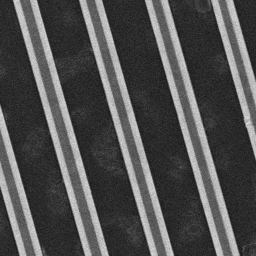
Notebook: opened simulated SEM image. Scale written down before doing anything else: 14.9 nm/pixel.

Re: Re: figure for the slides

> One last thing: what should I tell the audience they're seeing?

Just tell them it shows one or a few lines or trenches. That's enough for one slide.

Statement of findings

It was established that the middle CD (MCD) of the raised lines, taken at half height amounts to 237 nm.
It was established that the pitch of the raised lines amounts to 0.943 um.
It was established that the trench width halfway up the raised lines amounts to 700 nm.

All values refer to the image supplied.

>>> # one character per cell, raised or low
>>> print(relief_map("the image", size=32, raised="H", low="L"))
LLHHLLLLLLHHLLLLLLLHHLLLLLLHHLLL
LLHHHLLLLLLHHLLLLLLHHLLLLLLHHLLL
LLLHHLLLLLLHHLLLLLLHHLLLLLLHHLLL
LLLHHLLLLLLHHLLLLLLLHHLLLLLLHHLL
LLLHHLLLLLLLHHLLLLLLHHLLLLLLHHLL
LLLLHHLLLLLLHHLLLLLLHHLLLLLLHHLL
LLLLHHLLLLLLHHLLLLLLHHLLLLLLLHHL
LLLLHHLLLLLLHHLLLLLLLHHLLLLLLHHL
LLLLHHHLLLLLLHHLLLLLLHHLLLLLLHHL
LLLLLHHLLLLLLHHLLLLLLHHLLLLLLHHL
LLLLLHHLLLLLLHHLLLLLLHHHLLLLLLHH
LLLLLHHLLLLLLLHHLLLLLLHHLLLLLLHH
LLLLLLHHLLLLLLHHLLLLLLHHLLLLLLHH
LLLLLLHHLLLLLLHHLLLLLLHHLLLLLLLH
LLLLLLHHLLLLLLHHLLLLLLLHHLLLLLLH
LLLLLLHHHLLLLLLHHLLLLLLHHLLLLLLH
HLLLLLLHHLLLLLLHHLLLLLLHHLLLLLLH
HLLLLLLHHLLLLLLHHLLLLLLHHHLLLLLL
HLLLLLLHHLLLLLLHHHLLLLLLHHLLLLLL
HLLLLLLLHHLLLLLLHHLLLLLLHHLLLLLL
HHLLLLLLHHLLLLLLHHLLLLLLHHLLLLLL
HHLLLLLLHHLLLLLLHHLLLLLLLHHLLLLL
HHLLLLLLHHHLLLLLLHHLLLLLLHHLLLLL
HHHLLLLLLHHLLLLLLHHLLLLLLHHLLLLL
LHHLLLLLLHHLLLLLLHHLLLLLLHHLLLLL
LHHLLLLLLHHLLLLLLHHLLLLLLLHHLLLL
LHHLLLLLLHHHLLLLLLHHLLLLLLHHLLLL
LLHHLLLLLLHHLLLLLLHHLLLLLLHHLLLL
LLHHLLLLLLHHLLLLLLHHLLLLLLLHHLLL
LLHHLLLLLLHHHLLLLLLHHLLLLLLHHLLL
LLHHHLLLLLLHHLLLLLLHHLLLLLLHHLLL
LLLHHLLLLLLHHLLLLLLHHLLLLLLHHLLL